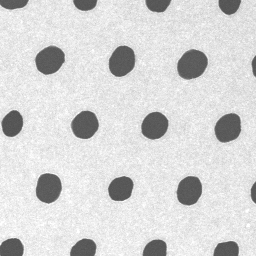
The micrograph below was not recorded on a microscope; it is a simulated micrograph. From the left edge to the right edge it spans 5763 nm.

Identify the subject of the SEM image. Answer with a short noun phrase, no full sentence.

a regular array of holes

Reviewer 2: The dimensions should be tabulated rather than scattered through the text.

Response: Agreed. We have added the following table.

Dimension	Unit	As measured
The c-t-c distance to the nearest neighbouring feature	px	70.4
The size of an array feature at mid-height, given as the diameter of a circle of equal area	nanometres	629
